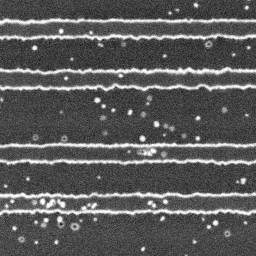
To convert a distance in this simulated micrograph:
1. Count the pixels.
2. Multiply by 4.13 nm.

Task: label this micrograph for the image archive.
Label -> lines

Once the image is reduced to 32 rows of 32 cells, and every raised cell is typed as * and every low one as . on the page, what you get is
................................
................................
......***.*...*....**..*..****..
********************************
********************************
................................
................................
................................
................................
********************************
********************************
................................
................................
................................
................................
................................
................................
................................
********************************
********************************
................................
................................
................................
................................
********..**********************
********************************
**.*..************.*.*******.***
................................
................................
................................
................................
................................